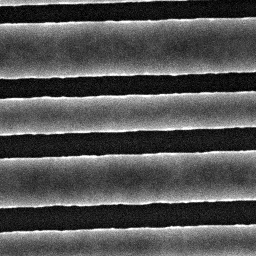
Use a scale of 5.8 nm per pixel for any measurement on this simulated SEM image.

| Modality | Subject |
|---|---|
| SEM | lines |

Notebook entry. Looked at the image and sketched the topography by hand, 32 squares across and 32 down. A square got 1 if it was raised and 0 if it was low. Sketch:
11111100000000000000000000000000
00000000000000000000000000000000
00000000000000000000011111111111
11111111111111111111111111111111
11111111111111111111111111111111
11111111111111111111111111111111
11111111111111111111111111111111
11111111111111111111111111111111
11111111111111111111111111111111
11111111110000000000000000000000
00000000000000000000000000000000
00000000000000000000000000000000
11111111111111111111111111111111
11111111111111111111111111111111
11111111111111111111111111111111
11111111111111111111111111111111
11111111111000000000000000000000
00000000000000000000000000000000
00000000000000000000000000000000
00000000000001111111111111111111
11111111111111111111111111111111
11111111111111111111111111111111
11111111111111111111111111111111
11111111111111111111111111111111
11111111111111111111111111111111
11111111111110000000000000000000
00000000000000000000000000000000
00000000000000000000000000000000
00000000000000000000111111111111
11111111111111111111111111111111
11111111111111111111111111111111
11111111111111111111111111111111